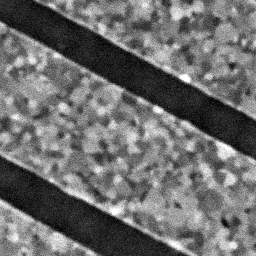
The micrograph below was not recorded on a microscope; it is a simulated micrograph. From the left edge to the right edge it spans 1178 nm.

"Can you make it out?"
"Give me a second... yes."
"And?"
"one or a few lines or trenches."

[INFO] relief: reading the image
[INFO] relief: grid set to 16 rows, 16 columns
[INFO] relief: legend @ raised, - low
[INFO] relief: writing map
---@@@@@@@@@@@@@
-----@@@@@@@@@@@
@@-----@@@@@@@@@
@@@@-----@@@@@@@
@@@@@@-----@@@@@
@@@@@@@------@@@
@@@@@@@@@-----@@
@@@@@@@@@@@-----
@@@@@@@@@@@@@---
@@@@@@@@@@@@@@@-
--@@@@@@@@@@@@@@
----@@@@@@@@@@@@
-----@@@@@@@@@@@
@@-----@@@@@@@@@
@@@------@@@@@@@
@@@@@------@@@@@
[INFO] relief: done